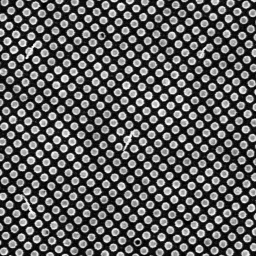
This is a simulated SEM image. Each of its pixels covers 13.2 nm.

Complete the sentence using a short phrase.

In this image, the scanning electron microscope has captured a regular array of raised bodies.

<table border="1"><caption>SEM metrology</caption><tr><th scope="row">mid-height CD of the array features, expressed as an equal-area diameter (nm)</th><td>97.8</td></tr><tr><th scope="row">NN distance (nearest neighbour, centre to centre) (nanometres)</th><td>142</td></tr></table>